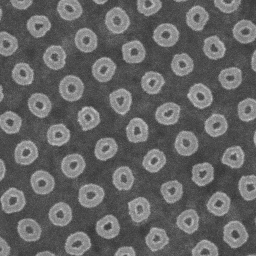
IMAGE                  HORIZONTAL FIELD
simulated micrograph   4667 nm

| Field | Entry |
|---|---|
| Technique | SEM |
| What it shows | a regular array of ring-shaped raised bodies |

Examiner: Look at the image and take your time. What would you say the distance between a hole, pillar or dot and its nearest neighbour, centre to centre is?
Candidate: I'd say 622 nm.